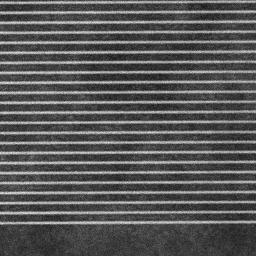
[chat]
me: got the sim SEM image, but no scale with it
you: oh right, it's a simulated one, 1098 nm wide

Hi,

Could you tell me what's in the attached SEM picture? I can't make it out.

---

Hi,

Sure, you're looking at parallel lines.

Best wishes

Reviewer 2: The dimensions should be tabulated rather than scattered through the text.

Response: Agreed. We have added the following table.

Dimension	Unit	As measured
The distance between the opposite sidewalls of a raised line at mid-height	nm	8.6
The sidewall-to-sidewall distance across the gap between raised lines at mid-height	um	0.0348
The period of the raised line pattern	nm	42.9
